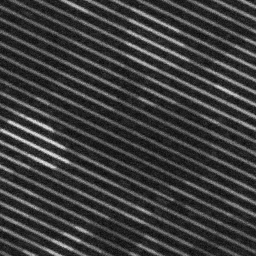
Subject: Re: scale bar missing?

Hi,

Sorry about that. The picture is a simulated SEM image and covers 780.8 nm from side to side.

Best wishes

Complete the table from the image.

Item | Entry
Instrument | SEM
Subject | parallel lines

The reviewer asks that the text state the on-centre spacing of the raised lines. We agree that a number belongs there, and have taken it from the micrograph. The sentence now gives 11 px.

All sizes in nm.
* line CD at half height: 7.2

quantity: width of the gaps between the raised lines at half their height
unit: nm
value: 26.5